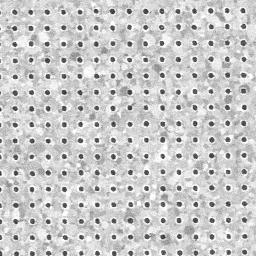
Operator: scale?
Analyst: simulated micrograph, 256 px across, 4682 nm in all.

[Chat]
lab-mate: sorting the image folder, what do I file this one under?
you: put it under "a regular array of holes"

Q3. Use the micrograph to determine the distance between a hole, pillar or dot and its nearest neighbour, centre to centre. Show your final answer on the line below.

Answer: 290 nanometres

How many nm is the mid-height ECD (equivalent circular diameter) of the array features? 109